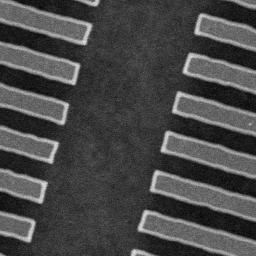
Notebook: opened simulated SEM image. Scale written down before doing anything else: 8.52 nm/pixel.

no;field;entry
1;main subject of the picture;groups of lines, slits or small figures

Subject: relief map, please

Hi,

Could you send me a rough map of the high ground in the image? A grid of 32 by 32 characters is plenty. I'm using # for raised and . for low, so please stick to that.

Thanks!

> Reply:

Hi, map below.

##.........#..................##
#####...........................
#########................###....
...########..............######.
.......####...............######
.............................###
####............................
########...............####.....
..########.............#######..
......###...............########
............................####
###.............................
#######...............####......
.#######..............#######...
.....###................########
...........................#####
##.............................#
######...............####.......
#######.............########....
....###................########.
..........................######
#............................###
####...............####.........
######.............########.....
..###.................########..
.........................#######
.............................###
####..............####..........
####..............########......
.###................#########...
........................########
.................#.........#####